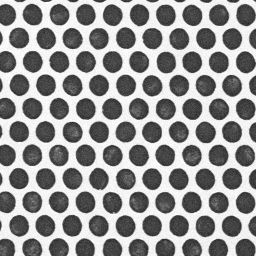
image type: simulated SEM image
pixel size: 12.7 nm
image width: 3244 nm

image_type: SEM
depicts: a regular array of holes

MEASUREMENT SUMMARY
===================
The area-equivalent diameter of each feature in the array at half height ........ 266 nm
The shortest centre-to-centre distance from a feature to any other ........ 335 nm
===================